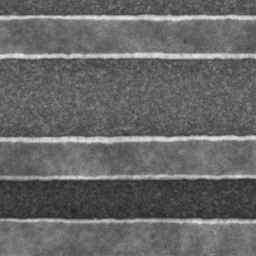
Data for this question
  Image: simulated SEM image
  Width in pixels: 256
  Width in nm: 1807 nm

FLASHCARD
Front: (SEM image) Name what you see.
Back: lines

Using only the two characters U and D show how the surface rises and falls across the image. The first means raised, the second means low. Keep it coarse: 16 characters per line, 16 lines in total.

DDDDDDDDDDDDDDDD
UUUUUUUUUUUUUUUU
UUUUUUUUUUUUUUUU
UUUUUUUUUUUUUUUU
DDDDDDDDDDDDDDDD
DDDDDDDDDDDDDDDD
DDDDDDDDDDDDDDDD
DDDDDDDDDDDDDDDD
DDDDDDDDDDDDDDDD
UUUUUUUUUUUUUUUU
UUUUUUUUUUUUUUUU
DDDDDDDDDDDDDDDD
DDDDDDDDDDDDDDDD
DDDDDDDDDDDDDDDD
UUUUUUUUUUUUUUUU
UUUUUUUUUUUUUUUU